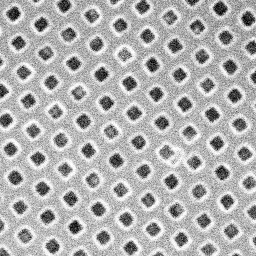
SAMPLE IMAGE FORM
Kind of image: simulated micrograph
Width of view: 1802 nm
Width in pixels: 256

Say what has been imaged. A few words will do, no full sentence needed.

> a regular array of holes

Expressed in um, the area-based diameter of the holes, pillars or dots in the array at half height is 0.108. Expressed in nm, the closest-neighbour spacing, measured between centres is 206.